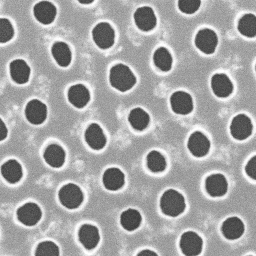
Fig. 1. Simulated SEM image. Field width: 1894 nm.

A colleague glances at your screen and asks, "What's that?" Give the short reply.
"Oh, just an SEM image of a regular array of holes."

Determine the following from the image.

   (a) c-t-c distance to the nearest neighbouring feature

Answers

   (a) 327 nanometers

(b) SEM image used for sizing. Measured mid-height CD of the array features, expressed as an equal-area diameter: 187 nm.